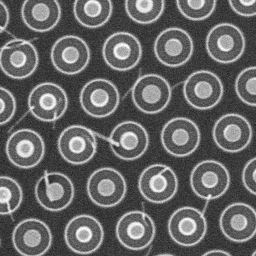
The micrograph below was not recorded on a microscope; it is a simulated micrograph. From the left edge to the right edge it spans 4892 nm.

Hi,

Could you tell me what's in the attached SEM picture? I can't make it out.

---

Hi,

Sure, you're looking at an array of small figures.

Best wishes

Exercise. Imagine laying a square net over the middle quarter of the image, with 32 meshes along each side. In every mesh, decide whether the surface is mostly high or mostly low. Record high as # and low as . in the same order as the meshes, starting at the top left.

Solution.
.....#######.....###############
....############################
################################
####################....#######.
#######....#######.......######.
######......######...#....####..
#####........#####..####..####..
####...####..####...####..####..
####...####..#####..####..#####.
.###...###...#####...##...#####.
#####........######......#######
#####.......########....########
#######....#####################
################################
###########################.....
##############.....#######......
#.....#######.......#####....#..
.......#####....#...#####..####.
.......#####...###...####..####.
..###...#####..###...####...###.
..###..#####...###...####.......
..##...#####........######......
.......######......#########..##
......#########..###############
##...###########################
#######################..#######
#########...#########.....######
########......######.......#####
#######.......#####....##...####
.#####...###...####...###...####
..####...###...####...###...####
..####...####..####....##...####